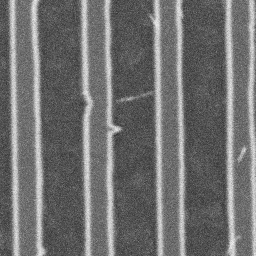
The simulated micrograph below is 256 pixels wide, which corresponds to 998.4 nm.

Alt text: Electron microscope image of one or a few lines or trenches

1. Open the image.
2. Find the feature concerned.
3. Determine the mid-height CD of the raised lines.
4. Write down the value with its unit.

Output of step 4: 96.7 nm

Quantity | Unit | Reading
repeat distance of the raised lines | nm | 280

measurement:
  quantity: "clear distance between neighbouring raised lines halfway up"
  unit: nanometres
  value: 183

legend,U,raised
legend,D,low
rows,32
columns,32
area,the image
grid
DUUUDDDDDDUUUUDDDDDUUUUDDDDDUUUU
DUUUDDDDDDUUUDDDDDDDUUUDDDDDUUUU
DUUUDDDDDDUUUUDDDDDDUUDDDDDDUUUU
DDUUDDDDDDUUUUDDDDDUUUUDDDDDUUUU
DDUUDDDDDDUUUUDDDDDDUUUDDDDDDUUU
DDUUUDDDDDUUUUDDDDDDUUUDDDDDDUUU
DDUUUDDDDDDUUUDDDDDDUUUDDDDDDUUU
DDUUUDDDDDDUUUDDDDDDUUDDDDDDDUUU
DDUUUDDDDDDUUUDDDDDDUUDDDDDDDUUU
DDUUUDDDDDDUUUDDDDDDUUUDDDDDDUUU
DDUUUDDDDDDUUUDDDDDDUUUDDDDDDUUD
DDUUUDDDDDDUUUDDDDDDUUUDDDDDDUUD
DDUUUDDDDDDUUUDDDDDDUUUDDDDDDUUD
DDUUUDDDDDDUUUDDDDDDUUUDDDDDDUUU
DDUUUDDDDDDUUUDDDDDDUUUDDDDDDUUU
DDUUUDDDDDDUUUDDDDDDUUUDDDDDDUUU
DDUUUDDDDDDUUUDDDDDDUUUDDDDDDUUU
DDUUUDDDDDDUUUDDDDDDUUUDDDDDDUUU
DDUUUDDDDDDUUUDDDDDDUUUDDDDDDUUU
DDUUUDDDDDDUUUDDDDDDUUUDDDDDDUUU
DDUUUDDDDDDUUUDDDDDDUUUDDDDDDUUU
DDUUUDDDDDDUUUDDDDDDUUUDDDDDDUUU
DDUUUDDDDDDUUUDDDDDDUUUDDDDDDUUU
DDUUUDDDDDDUUUDDDDDDUUUDDDDDDUUU
DDUUUDDDDDDUUUDDDDDDUUUDDDDDDUUU
DDUUUDDDDDDUUUDDDDDDUUUDDDDDDUUU
DDUUUDDDDDDUUUDDDDDDUUUDDDDDDUUU
DDUUUDDDDDDUUUDDDDDDUUUDDDDDDUUU
DDUUUDDDDDDUUUDDDDDDUUUDDDDDDUUU
DDUUUDDDDDDUUUDDDDDDUUUDDDDDDUUU
DDUUUDDDDDDUUUDDDDDDUUUDDDDDDUUU
DDUUUDDDDDDUUUDDDDDDUUUDDDDDDUUU